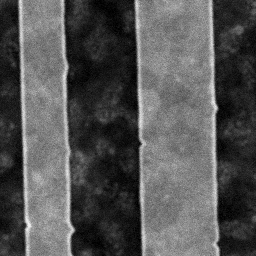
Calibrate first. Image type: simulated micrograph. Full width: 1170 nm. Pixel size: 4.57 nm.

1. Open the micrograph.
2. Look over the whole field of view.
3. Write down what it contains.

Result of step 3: one or a few lines or trenches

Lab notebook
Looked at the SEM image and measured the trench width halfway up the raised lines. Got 0.338 microns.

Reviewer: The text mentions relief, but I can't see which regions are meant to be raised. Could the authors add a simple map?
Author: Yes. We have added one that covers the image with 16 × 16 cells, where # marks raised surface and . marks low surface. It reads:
.###.....####...
.###.....####...
.###.....####...
.###.....####...
.###.....####...
.###.....####...
.###.....####...
.###.....####...
.###.....####...
..##.....####...
..##.....####...
..##.....####...
..##.....#####..
..##.....#####..
..##.....#####..
..##.....#####..